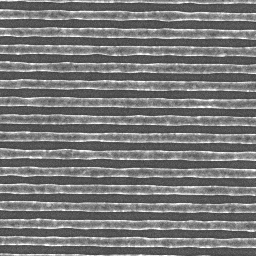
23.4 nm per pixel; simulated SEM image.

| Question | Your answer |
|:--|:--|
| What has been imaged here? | wiring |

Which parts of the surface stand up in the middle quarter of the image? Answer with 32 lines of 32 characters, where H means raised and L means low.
HHHHHHHHHHHHHHHHHHHHHHHHHHHHHHHH
HHHHHHHHHHHHHHHHHHHHHHHHHHHHHHHH
LLLLLLLLLLLLLLLLLLLLLLLLLLLLLLLL
LLLLLLLLLLLLLLLLLLLLLLLLLLLLLLLL
HHHHHHHHHHHHHHHHHHHHHHHHHHHHHHLH
HHHHHHHHHHHHHHHHHHHHHHHHHHHHHHHH
LLLLLLLLLLLLLLLLLLLLLLHHHHLLLLLL
LLLLLLLLLLLLLLLLLLLLLLLLLLLLLLLL
HHLLLLLLLLLLLLLLLLLLLLLLLLLLLLLL
HHHHHHHHHHHHHHHHHHHHHHHHHHHHHHHH
HHHHHHHHHHHHHHHHHHHHHHHHHHHHHHHH
LLLLLLLLLLLLLLLLLLLLLLLLLLLLLLLL
LLLLLLLLLLLLLLLLLLLLLLLLLLLLLLLL
HHHHHHHHHHHHHHHHHHHHHHHHHHHHHHHH
HHHHHHHHHHHHHHHHHHHHHHHHHHHHHHHH
LLLLLLLLLLLLLLLLLLLLLLLLLLLLLLLL
LLLLLLLLLLLLLLLLLLLLLLLLLLLLLLLL
HHHHHHLLLHHHHHHHHHLLLHHHLHHHHHHH
HHHHHHHHHHHHHHHHHHHHHHHHHHHHHHHH
LLLLLLLLLLLLLLLLLLLLLLLLLLLLHHHH
LLLLLLLLLLLLLLLLLLLLLLLLLLLLLLLL
HHLLLLLLLLLLLLLLLLLLLLLLLLLLLLLL
HHHHHHHHHHHHHHHHHHHHHHHHHHHHHHHH
HHHHHHHHHHHHHHHHHHHHHHHHHHHHHHHH
LLLLLLLLLLLLLLLLLLLLLLLLLLLLLLLL
LLLLLLLLLLLLLLLLLLLLLLLLLLLLLLLL
HHHHHHHHHHHHHHHHHHHHHHHHHHHHHHHH
HHHHHHHHHHHHHHHHHHHHHHHHHHHHHHHH
LLLLLLLLLLLLLLLLLLLLLLLLLLLLLLLL
LLLLLLLLLLLLLLLLLLLLLLLLLLLLLLLL
HHHHHHHHHHHHHHHHHHHHHHHLLLLLLLLL
HHHHHHHHHHHHHHHHHHHHHHHHHHHHHHHH